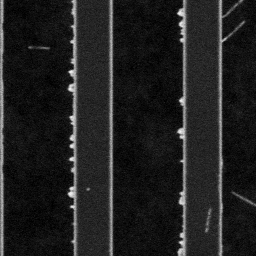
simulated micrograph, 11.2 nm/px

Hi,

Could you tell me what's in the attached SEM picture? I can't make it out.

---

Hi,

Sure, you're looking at lines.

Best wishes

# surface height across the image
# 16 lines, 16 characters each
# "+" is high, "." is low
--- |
.....++....+++..
.....++....+++..
.....++....+++..
.....++....+++..
.....++....+++..
.....++....+++..
.....++....+++..
.....++....+++..
.....++....+++..
.....++....+++..
.....++....+++..
.....++....+++..
.....++....+++..
.....++....+++..
.....++....+++..
.....++....+++..